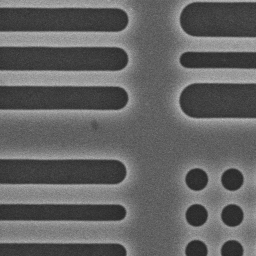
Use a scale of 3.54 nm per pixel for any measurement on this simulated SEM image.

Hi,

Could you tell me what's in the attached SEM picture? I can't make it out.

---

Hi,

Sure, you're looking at groups of lines, slits or small figures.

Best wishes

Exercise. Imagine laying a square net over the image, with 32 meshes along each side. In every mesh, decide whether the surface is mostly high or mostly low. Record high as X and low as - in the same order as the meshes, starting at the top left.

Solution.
XXXXXXXXXXXXXXXXXXXXXXXX--------
----------------XXXXXXX---------
----------------XXXXXX----------
----------------XXXXXXX---------
XXXXXXXXXXXXXXXXXXXXXXXX--------
XXXXXXXXXXXXXXXXXXXXXXXXXXXXXXXX
----------------XXXXXXX---------
----------------XXXXXXX---------
---------------XXXXXXXX---------
XXXXXXXXXXXXXXXXXXXXXXXXXXXXXXXX
XXXXXXXXXXXXXXXXXXXXXXXX--------
----------------XXXXXXX---------
----------------XXXXXX----------
---------------XXXXXXXX---------
XXXXXXXXXXXXXXXXXXXXXXXX--------
XXXXXXXXXXXXXXXXXXXXXXXXXXXXXXXX
XXXXXXXXXXXXXXXXXXXXXXXXXXXXXXXX
XXXXXXXXXXXXXXXXXXXXXXXXXXXXXXXX
XXXXXXXXXXXXXXXXXXXXXXXXXXXXXXXX
XXXXXXXXXXXXXXXXXXXXXXXXXXXXXXXX
---------------XXXXXXXXXXXXXXXXX
----------------XXXXXXXX--XX--XX
---------------XXXXXXXX---XX--XX
XXXXXXXXXXXXXXXXXXXXXXXX-XXX--XX
XXXXXXXXXXXXXXXXXXXXXXXXXXXXXXXX
--------XXXXXXXXXXXXXXXXXXXXXXXX
----------------XXXXXXX---XX--XX
---------------XXXXXXXX---XX--XX
XXXXXXXXXXXXXXXXXXXXXXXXXXXXXXXX
XXXXXXXXXXXXXXXXXXXXXXXXXXXXXXXX
---------------XXXXXXXXX--XX--XX
----------------XXXXXXX---XX--XX